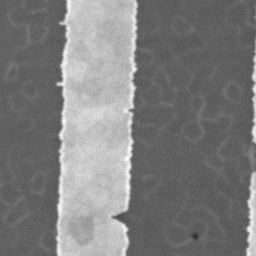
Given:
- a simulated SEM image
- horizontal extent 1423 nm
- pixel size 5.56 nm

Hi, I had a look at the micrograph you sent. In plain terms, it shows one or a few lines or trenches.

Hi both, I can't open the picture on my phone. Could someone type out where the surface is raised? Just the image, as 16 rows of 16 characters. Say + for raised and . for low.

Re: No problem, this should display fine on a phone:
....++++........
....++++........
....++++........
....++++........
....++++........
....++++........
....++++........
....++++........
....++++........
....++++........
....++++........
....++++........
....++++........
....+++.........
....++++........
....++++........